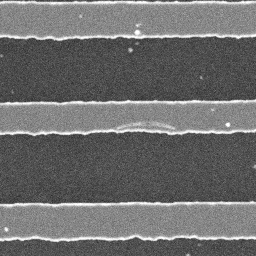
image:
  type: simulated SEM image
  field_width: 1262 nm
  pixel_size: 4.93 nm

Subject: lines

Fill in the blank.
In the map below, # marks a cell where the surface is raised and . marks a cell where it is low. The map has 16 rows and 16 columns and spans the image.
################
################
................
................
................
................
################
################
................
................
................
................
................
################
################
................